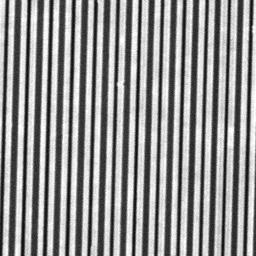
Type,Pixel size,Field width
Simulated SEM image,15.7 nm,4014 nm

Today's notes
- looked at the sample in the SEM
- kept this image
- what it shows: parallel lines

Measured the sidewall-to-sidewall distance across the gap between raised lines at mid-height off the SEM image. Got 0.0823 microns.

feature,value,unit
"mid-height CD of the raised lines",82.3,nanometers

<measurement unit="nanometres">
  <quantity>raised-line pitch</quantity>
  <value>175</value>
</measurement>